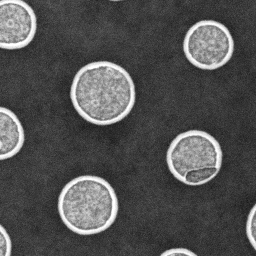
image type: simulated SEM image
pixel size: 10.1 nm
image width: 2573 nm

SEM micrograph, raised bodies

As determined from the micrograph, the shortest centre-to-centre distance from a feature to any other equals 1100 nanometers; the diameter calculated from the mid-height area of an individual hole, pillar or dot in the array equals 517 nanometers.